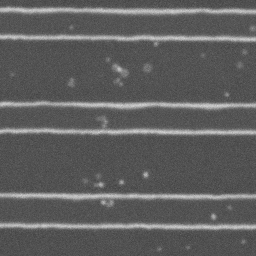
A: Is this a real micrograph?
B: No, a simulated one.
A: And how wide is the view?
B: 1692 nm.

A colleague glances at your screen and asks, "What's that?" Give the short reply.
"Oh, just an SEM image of lines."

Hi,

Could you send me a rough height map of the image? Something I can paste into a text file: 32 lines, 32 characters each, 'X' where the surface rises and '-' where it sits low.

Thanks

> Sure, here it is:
--------------------------------
XXXXXXXXXXXXXXXXXXXXXXXXXXXXXXXX
XXXXXXXXXXXXXXXXXXXXXXXXXXXXXXXX
XXXXXXXXXXXXXXXXXXXXXXXXXXXXXXXX
XXXXXXXXXXXXXXXXXXXXXXXXXXXXXXXX
--------------------------------
--------------------------------
--------------------------------
--------------------------------
--------------------------------
--------------------------------
--------------------------------
--------------------------------
XXXXXXXXXXXXXXXXXXXXXXXXXXXXXXXX
XXXXXXXXXXXXXXXXXXXXXXXXXXXXXXXX
XXXXXXXXXXXXXXXXXXXXXXXXXXXXXXXX
--------XXXXXXXXX-XXXXXXXXXXXXXX
--------------------------------
--------------------------------
--------------------------------
--------------------------------
--------------------------------
--------------------------------
--------------------------------
XXXXXXXXX-XXXXXXXX-XX---------X-
XXXXXXXXXXXXXXXXXXXXXXXXXXXXXXXX
XXXXXXXXXXXXXXXXXXXXXXXXXXXXXXXX
XXXXXXXXXXXXXXXXXXXXXXXXXXXXXXXX
--------------------------XX----
--------------------------------
--------------------------------
--------------------------------